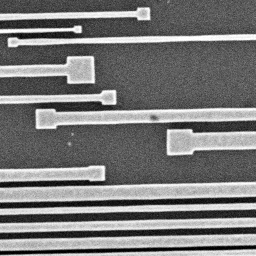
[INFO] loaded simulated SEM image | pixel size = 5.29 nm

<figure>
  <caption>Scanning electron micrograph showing groups of lines, slits or small figures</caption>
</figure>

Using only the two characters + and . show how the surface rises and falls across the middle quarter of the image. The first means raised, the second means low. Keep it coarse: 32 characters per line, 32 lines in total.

+++++++.........................
+++++++.........................
+++++++.........................
.++++++.........................
.++++++.........................
................................
................................
.........++++...................
+++++++++++++...................
.........++++...................
................................
.........................+++++++
++++++++++++++++++++++++++++++++
++++++++++++++++++++++++++++++++
++++++++++++++++++++++++++......
................................
..........................++++++
..........................++++++
..........................++++++
..........................++++++
..........................++++++
..........................++++++
..........................+++...
................................
................................
................................
++++++++++......................
++++++++++......................
++++++++++......................
................................
.............+++++++++++++++++++
++++++++++++++++++++++++++++++++